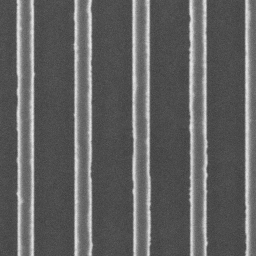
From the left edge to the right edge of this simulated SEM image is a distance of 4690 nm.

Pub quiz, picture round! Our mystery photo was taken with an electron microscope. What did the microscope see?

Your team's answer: lines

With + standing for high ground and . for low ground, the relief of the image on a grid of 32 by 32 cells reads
..++.....++......++.....++.....+
..++.....++......++.....++.....+
..++.....++......++.....++.....+
..++.....++......++.....++.....+
..++.....++......++.....++.....+
..++.....++......++.....++.....+
..++.....++......++.....++.....+
..++.....++......++.....++.....+
..++.....++......++.....++.....+
..++.....++......++.....++.....+
..++.....++......++.....++.....+
..++.....++......++.....++.....+
..++.....++......++.....++.....+
..++.....++......++.....++.....+
..++.....++......++.....++.....+
..++.....++......++.....++.....+
..++.....++......++.....++.....+
..++.....++......++.....++.....+
..++.....++......++.....++.....+
..++.....++......++.....++.....+
..++.....++......++.....++.....+
..++.....++......++.....++.....+
..++.....++......++.....++.....+
..++.....++......++.....++.....+
..++.....++......++.....++.....+
..++.....++......++.....++.....+
..++.....++......++.....++.....+
..++.....++......++.....++.....+
..++.....++......++.....++.....+
..++.....++......++.....++.....+
..++.....++......++.....++.....+
..++.....++......++.....++.....+